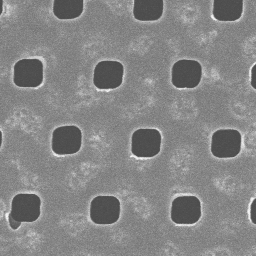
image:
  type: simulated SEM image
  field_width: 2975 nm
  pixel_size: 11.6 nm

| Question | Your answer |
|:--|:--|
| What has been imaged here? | a regular array of holes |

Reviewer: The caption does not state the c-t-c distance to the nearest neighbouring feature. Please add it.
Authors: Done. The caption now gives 904 nm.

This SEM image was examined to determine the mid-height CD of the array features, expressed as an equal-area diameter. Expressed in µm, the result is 0.357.